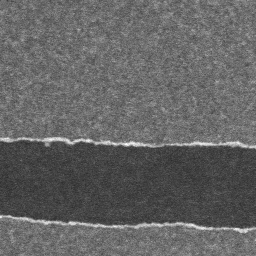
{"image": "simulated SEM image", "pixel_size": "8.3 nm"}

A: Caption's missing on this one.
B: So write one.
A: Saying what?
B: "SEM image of one or a few lines or trenches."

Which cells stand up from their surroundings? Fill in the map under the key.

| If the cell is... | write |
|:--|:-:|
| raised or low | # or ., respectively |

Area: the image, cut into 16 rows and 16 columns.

################
################
################
################
################
################
################
################
################
................
................
................
................
................
################
################